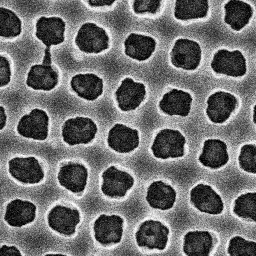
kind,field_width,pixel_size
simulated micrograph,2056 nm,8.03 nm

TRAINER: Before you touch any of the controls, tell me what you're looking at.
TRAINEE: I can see a regular array of holes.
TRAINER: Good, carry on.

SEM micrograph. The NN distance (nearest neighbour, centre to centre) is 349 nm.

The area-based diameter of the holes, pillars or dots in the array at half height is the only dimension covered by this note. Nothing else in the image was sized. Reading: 256 nm